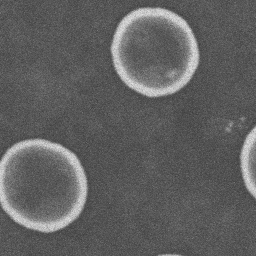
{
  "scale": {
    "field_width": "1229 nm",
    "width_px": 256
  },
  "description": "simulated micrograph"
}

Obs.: raised bodies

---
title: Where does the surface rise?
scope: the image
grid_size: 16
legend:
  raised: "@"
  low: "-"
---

----------------
--------@@@-----
-------@@@@@----
-------@@@@@----
--------@@@@----
---------@@-----
----------------
----------------
----------------
-@@@-----------@
@@@@@----------@
@@@@@-----------
@@@@@-----------
-@@@@-----------
----------------
----------------